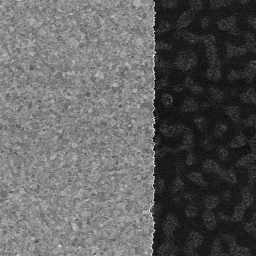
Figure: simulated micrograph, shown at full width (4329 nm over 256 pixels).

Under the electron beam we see one or a few lines or trenches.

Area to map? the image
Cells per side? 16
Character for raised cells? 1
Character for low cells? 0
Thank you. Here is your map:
1111111111000000
1111111111000000
1111111111000000
1111111111000000
1111111111000000
1111111111000000
1111111111000000
1111111111000000
1111111111000000
1111111111000000
1111111111000000
1111111111000000
1111111111000000
1111111110000000
1111111111000000
1111111111000000